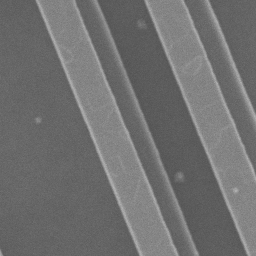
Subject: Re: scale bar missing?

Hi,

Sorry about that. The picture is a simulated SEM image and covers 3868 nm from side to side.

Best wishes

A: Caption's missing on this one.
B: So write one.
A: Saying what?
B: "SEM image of lines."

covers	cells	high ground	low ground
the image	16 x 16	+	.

..++++...++++...
...++++...++++..
...++++...++++..
....+++...++++..
....++++...++++.
.....+++...++++.
.....++++...++++
.....++++...++++
......+++...++++
......++++...+++
.......+++...+++
.......++++...++
.......++++...++
........+++....+
........++++...+
.........+++...+